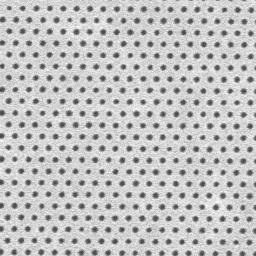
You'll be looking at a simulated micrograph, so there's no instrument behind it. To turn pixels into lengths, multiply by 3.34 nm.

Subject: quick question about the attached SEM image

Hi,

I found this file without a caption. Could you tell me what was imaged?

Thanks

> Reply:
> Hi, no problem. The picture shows a regular array of holes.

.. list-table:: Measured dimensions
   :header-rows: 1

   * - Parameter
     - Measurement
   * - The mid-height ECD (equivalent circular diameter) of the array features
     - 6.38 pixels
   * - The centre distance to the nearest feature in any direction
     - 43.5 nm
